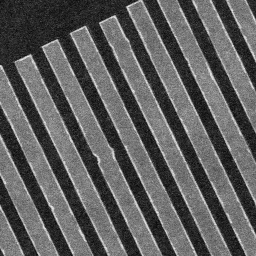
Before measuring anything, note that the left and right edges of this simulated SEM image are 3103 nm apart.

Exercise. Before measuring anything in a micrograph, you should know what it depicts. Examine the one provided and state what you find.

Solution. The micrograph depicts parallel lines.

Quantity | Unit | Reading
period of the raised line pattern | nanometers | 376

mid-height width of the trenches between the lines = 160 nm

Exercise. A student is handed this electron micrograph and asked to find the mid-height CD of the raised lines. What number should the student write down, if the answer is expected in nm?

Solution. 220